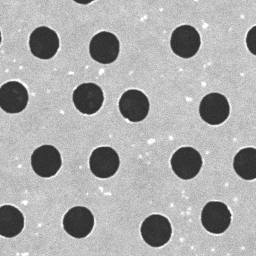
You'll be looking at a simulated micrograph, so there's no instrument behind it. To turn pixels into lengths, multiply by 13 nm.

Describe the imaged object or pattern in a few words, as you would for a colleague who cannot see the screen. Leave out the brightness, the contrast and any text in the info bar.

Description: a regular array of holes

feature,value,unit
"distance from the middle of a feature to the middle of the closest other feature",0.793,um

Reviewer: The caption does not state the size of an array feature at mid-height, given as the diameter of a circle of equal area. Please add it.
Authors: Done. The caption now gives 411 nm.